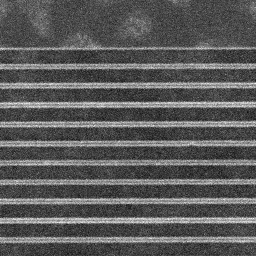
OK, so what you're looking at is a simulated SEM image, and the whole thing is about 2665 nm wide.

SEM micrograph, parallel lines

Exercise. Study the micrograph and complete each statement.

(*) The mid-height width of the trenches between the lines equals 15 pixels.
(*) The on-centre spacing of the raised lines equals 201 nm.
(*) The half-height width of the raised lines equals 45.6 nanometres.